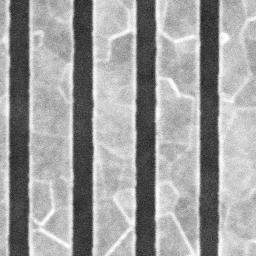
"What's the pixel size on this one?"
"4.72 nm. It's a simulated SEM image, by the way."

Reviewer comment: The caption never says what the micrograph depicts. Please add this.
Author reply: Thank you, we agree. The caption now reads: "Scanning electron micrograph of lines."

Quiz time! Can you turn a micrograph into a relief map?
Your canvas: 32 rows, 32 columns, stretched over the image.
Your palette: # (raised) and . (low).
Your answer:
#...#####...#####...#####...####
#...#####...#####...#####...####
#...#####...#####...#####...####
#...#####...#####...#####...####
#...#####...#####...#####...####
#...#####...#####...#####...####
#...#####...#####...#####...####
#...#####...#####...#####...####
#...#####...#####...#####...####
#...#####...#####...#####...####
#...#####...#####...#####..#####
#...#####...#####...#####...####
#...#####...#####...#####...####
#...#####...#####...#####...####
#...#####...#####...#####..#####
#...#####...#####...#####..#####
#...#####...#####...#####..#####
#...#####...#####...#####...####
#...#####...#####...#####...####
#...#####...#####...#####...####
#...#####...#####...#####...####
#...#####...#####...#####...####
#...#####...#####...#####...####
#...#####...#####...#####...####
#...#####...#####...#####...####
#...#####...#####...#####...####
#...#####...#####...#####...####
#...#####...#####...#####...####
#...#####...#####...#####...####
#...#####...#####...#####...####
#...#####...#####...#####..#####
#...#####...#####...#####..#####